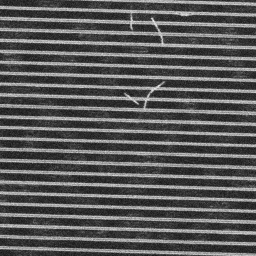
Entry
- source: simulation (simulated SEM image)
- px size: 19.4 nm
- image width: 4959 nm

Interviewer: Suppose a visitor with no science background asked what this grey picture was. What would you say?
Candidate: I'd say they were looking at parallel lines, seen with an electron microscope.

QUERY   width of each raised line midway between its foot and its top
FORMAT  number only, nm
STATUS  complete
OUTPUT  41.1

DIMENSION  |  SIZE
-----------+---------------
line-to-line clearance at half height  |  8.87 pixels